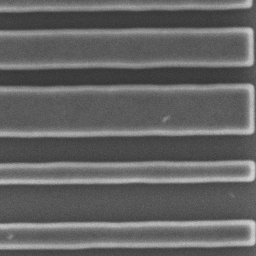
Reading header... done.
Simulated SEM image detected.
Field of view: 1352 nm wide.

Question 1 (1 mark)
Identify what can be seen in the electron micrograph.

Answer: groups of lines, slits or small figures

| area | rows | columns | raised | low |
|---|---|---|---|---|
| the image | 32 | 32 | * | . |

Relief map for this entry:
*******************************.
................................
................................
................................
*******************************.
*******************************.
*******************************.
*******************************.
................................
................................
................................
********************************
********************************
********************************
********************************
********************************
****************************....
................................
................................
................................
..................****....*****.
********************************
*****************.******........
................................
................................
................................
................................
................................
********************************
********************************
*****************************...
................................